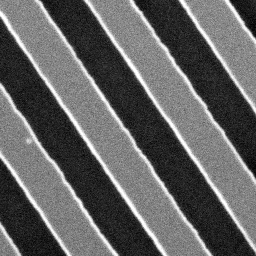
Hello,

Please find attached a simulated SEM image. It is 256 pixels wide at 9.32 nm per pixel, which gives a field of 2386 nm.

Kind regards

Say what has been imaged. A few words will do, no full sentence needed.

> lines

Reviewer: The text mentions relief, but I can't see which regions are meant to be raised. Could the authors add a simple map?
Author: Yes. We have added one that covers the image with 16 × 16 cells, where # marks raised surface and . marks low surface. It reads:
###...###...###.
###...###...###.
.###...###...###
..###...###...##
..###...###...##
...###...###...#
#...###...###...
##..###...###...
##...###...###..
###...###...###.
.###..####..###.
.###...###...###
..###...###...##
...###..####..##
...###...###...#
#...###...###...